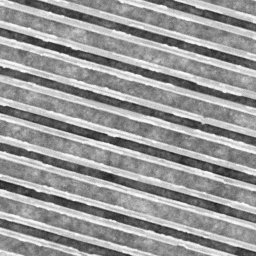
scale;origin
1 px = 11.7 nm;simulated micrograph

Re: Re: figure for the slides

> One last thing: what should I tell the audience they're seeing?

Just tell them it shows parallel lines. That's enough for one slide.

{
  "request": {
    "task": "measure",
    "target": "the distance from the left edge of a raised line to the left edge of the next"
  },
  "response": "18.3 pixels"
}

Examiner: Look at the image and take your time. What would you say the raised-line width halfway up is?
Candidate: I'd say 71.6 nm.